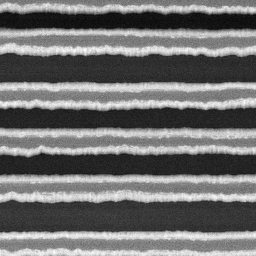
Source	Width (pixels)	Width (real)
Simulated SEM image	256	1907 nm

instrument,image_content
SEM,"lines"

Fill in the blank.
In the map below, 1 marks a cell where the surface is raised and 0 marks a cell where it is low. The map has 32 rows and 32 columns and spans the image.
11111111111111111111111111111111
00110000111110010000111101111111
00000000000000000000000000000000
00000000000000000000000000000000
11111111111111111111111111111111
11111111111111111111111111111111
10111111111111111111111111111111
00000000000000000000000000000000
00000000000000000000000000000000
00000000000000000000000000000000
11111110111100000011111000011111
11111111111111111111111111111111
11111111111111111111111111111111
00000010000111000000000001010000
00000000000000000000000000000000
00000000000000000000000000000000
11111111111111111111111111111111
11111111111111111111111111111111
11111111111111111111111111111111
00000000000000000000000000000000
00000000000000000000000000000000
00000000000000000000000000000000
11111111111111111111111111111111
11111111111111111111111111111111
11111111111111111111111111111111
00000000000000000000000000000000
00000000000000000000000000000000
00000000000000000000000000000000
00000000000000000000000000000000
11111111111111111111111111111111
11111111111111111111111111111111
11111111111111111111111111111111